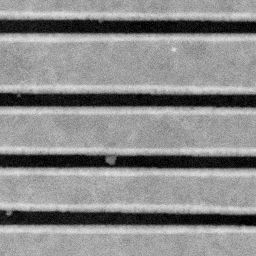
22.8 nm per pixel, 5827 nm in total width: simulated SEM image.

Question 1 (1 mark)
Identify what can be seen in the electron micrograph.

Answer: lines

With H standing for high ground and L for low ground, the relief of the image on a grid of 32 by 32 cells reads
HHHHHHHHHHHHHHHHHHHHHHHHHHHHHHHH
HHHHHHHHHHHHHHHHHHHHHHHHHHHHHHHH
LLLLLLLLLLLLLLLLLLLLLLLLLLLLLLLL
LLLLLLLLLLLLLLLLLLLLLLLLLLLLLLLL
LLLLLLLLLLLLLLLHHHHHHHHHHHHLLHHH
HHHHHHHHHHHHHHHHHHHHHHHHHHHHHHHH
HHHHHHHHHHHHHHHHHHHHHHHHHHHHHHHH
HHHHHHHHHHHHHHHHHHHHHHHHHHHHHHHH
HHHHHHHHHHHHHHHHHHHHHHHHHHHHHHHH
HHHHHHHHHHHHHHHHHHHHHHHHHHHHHHHH
HHHHHHHHHHHHHHHHHHHHHHHHHHHHHHHH
LLLLLLLLLLLLLLLLLLLLLLLLLLLLLHHH
LLLLLLLLLLLLLLLLLLLLLLLLLLLLLLLL
LLLLLLLLLLLLLLLLLLLLLLLLLLLLLLLL
HHHHHHHHHHHHHHHHHHHHHHHHHHHHHHHH
HHHHHHHHHHHHHHHHHHHHHHHHHHHHHHHH
HHHHHHHHHHHHHHHHHHHHHHHHHHHHHHHH
HHHHHHHHHHHHHHHHHHHHHHHHHHHHHHHH
HHHHHHHHHHHHHHHHHHHHHHHHHHHHHHHH
LLLLLLLLLLLLLLLLLLLLLLLLLLLLLLLL
LLLLLLLLLLLLLLLLLLLLLLLLLLLLLLLL
HHHHHHHHHHHHHHHHHHHHHHHHHHHHHHHH
HHHHHHHHHHHHHHHHHHHHHHHHHHHHHHHH
HHHHHHHHHHHHHHHHHHHHHHHHHHHHHHHH
HHHHHHHHHHHHHHHHHHHHHHHHHHHHHHHH
HHHHHHHHHHHHHHHHHHHHHHHHHHHHHHHH
LLLLLLLLLLLLLLLLLLLLLLLLLLLLLLLH
LLLLLLLLLLLLLLLLLLLLLLLLLLLLLLLL
HHHLLLLLLLLLLLLLLLLLLLLLLLLLLLLL
HHHHHHHHHHHHHHHHHHHHHHHHHHHHHHHH
HHHHHHHHHHHHHHHHHHHHHHHHHHHHHHHH
HHHHHHHHHHHHHHHHHHHHHHHHHHHHHHHH